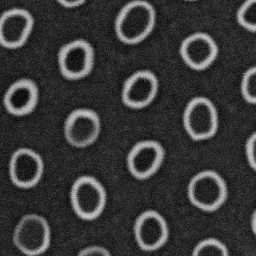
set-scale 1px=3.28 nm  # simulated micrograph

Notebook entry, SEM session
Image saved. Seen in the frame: a regular array of raised bodies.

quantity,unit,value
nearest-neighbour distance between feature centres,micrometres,0.224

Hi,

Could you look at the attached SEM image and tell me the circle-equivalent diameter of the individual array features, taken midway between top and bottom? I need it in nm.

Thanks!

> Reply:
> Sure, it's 119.